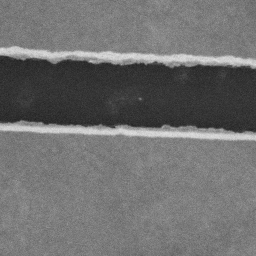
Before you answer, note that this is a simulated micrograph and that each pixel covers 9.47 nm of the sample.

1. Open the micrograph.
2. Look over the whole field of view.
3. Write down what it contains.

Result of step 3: one or a few lines or trenches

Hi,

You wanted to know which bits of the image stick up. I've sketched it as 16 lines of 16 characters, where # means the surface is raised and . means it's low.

################
################
################
.......#########
................
................
................
................
############....
################
################
################
################
################
################
################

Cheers